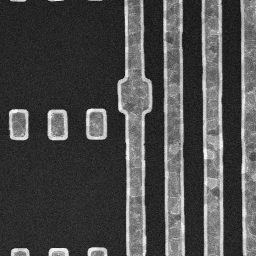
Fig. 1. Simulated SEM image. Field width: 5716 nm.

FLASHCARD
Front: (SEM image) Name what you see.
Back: wiring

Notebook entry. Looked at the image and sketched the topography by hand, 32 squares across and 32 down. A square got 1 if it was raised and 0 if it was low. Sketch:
00000000000000001100011001110011
00000000000000001100011001110011
00000000000000001100011001110011
00000000000000001100011001110011
00000000000000001100011000110011
00000000000000001100011000110011
00000000000000001100011000110011
00000000000000001100011000110011
00000000000000001100011000110011
00000000000000001100011000110011
00000000000000011110011000110011
00000000000000011110011000110011
00000000000000011110011000110011
00000000000000011110011000110011
01100011000110001100011000110011
01100011000110001100011000110011
01100011000110001100011000110011
00000000000000001100011000110011
00000000000000001100011000110011
00000000000000001100011000110011
00000000000000001100011000110011
00000000000000001100011000110011
00000000000000001100011000110011
00000000000000001100011000110011
00000000000000001100011000110011
00000000000000001100011000110001
00000000000000001100011000110001
00000000000000001100011000110001
00000000000000001100011000110001
00000000000000001100011000110001
00000000000000001100011000110001
00100001000110001100011000110001